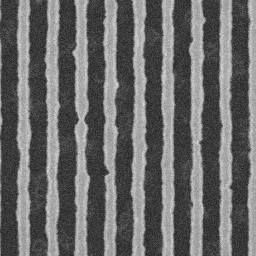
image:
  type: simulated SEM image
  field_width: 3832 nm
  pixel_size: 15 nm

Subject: parallel lines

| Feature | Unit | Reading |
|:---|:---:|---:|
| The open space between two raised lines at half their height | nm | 305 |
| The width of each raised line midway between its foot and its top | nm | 125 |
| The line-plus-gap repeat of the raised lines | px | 28.8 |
